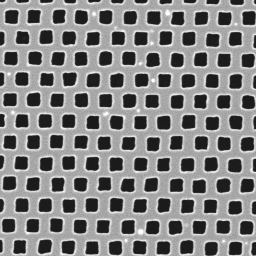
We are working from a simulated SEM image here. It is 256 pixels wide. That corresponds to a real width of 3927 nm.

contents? a regular array of holes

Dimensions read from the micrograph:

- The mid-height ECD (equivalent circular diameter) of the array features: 227 nm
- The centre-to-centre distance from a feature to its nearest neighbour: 354 nm